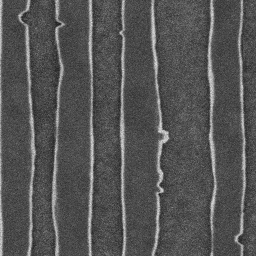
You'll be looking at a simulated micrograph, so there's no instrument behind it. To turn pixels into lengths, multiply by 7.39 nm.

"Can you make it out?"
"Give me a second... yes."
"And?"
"one or a few lines or trenches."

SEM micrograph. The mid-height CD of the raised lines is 240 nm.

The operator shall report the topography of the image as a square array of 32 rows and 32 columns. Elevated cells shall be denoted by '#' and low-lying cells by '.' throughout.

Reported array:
####...####....####........###..
###....####....####........###..
###....####....####........###..
###....####....####.......####..
###....####....####.......####..
###....####.....###.......####..
###....####....####.......####..
###.....###....####.......####..
####....###....####.......####..
####....###....####.......####..
####....###....#####......####..
####...####....#####......####..
####...####....#####......####..
####...####....#####.......###..
####...####....#####......####..
####...####....#####......####..
####...####....#####......####..
####...####....######.....####..
####...####....#####......####..
####...####....#####.......###..
####...####....#####.......###..
####...####....#####.......###..
####...####....#####.......###..
####...####....#####.......###..
####...####....#####.......###..
####...####....#####.......###..
####...####.....####.......###..
####...####.....####.......###..
####...####.....####.......###..
####...####.....####.......###..
####...####.....###........###..
####...####.....###........###..